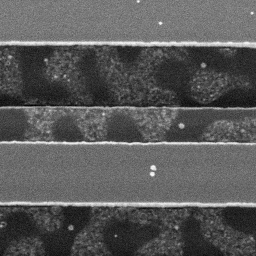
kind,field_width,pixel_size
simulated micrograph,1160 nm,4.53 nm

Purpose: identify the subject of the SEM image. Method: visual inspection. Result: lines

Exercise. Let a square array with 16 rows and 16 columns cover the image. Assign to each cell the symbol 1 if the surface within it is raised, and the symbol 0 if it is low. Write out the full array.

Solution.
1111111111111111
1111111111111111
1111111111111111
0000000000000000
0000000000000000
0000000000000000
0000000000000000
0000000000000000
0000000000000000
1111111111111111
1111111111111111
1111111111111111
1111111111111111
0000000000000000
0000000000000000
0000000000000000